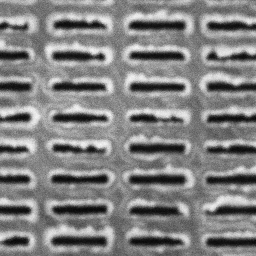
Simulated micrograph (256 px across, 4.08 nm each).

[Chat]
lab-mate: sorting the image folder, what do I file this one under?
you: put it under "a regular array of holes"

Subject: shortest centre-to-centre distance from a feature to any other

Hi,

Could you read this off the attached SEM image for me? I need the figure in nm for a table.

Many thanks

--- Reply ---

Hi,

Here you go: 124